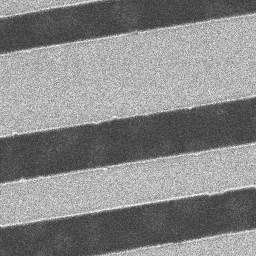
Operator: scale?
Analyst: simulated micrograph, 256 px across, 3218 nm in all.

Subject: one or a few lines or trenches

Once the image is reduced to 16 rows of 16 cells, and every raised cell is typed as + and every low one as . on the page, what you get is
...+++++++++++++
++++++++++++....
++++++..........
................
................
................
.............+++
.......+++++++++
++++++++++++++++
+++++++++++++...
+++++++.........
................
..........++++++
....++++++++++++
+++++++++++++++.
+++++++++.......